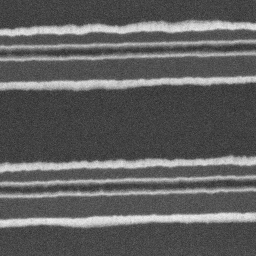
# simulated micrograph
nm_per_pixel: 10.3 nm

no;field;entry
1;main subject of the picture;lines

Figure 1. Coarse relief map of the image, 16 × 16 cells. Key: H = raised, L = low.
LLLLLLLLLLLLLLLL
LLLLLLLLLLLLLLLL
HHHHHHHHHHHHHHHH
HHHHHHHHHHHHHHHH
HHHHHHHHHHHHHHHH
LLLLLLLLLLLLLLLL
LLLLLLLLLLLLLLLL
LLLLLLLLLLLLLLLL
LLLLLLLLLLLLLLLL
LLLLLLLLLLLLLLLL
LLHHHHHHHHHHHHHH
HHHHHHHHHHHHHHHH
HHHHHHHHHHHHHHHH
HHHHHHHHHHHHHLLL
LLLLLLLLLLLLLLLL
LLLLLLLLLLLLLLLL